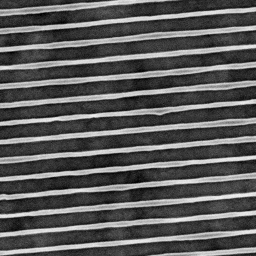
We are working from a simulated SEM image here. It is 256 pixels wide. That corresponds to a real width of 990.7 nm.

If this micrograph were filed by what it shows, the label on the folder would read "parallel lines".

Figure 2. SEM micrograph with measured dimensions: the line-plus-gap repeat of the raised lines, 71.3 nm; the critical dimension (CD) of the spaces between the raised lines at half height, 53.5 nanometers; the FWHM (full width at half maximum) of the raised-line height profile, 0.0169 um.